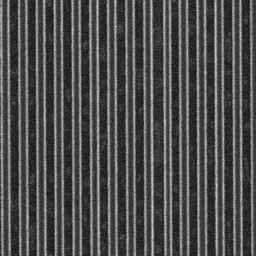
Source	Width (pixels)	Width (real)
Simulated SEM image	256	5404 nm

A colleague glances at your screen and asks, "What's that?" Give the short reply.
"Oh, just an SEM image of parallel lines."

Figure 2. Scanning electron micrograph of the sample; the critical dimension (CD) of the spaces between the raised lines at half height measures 0.208 micrometres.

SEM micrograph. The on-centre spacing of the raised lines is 17.8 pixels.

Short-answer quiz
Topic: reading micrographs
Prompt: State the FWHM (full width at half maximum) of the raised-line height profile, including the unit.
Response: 0.169 µm